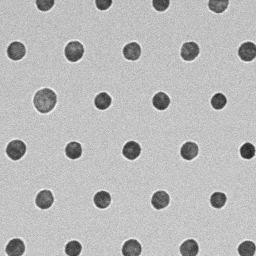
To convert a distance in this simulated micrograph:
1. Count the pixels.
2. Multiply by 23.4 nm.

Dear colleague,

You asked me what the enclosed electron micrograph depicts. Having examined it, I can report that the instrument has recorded a regular array of holes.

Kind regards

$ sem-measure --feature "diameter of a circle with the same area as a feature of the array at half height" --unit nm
455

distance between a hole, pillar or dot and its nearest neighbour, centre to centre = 1340 nanometres